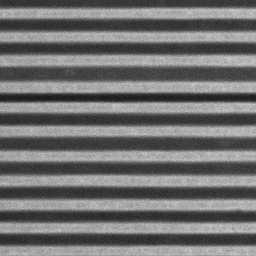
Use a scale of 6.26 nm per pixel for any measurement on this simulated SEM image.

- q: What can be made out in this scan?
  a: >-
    parallel lines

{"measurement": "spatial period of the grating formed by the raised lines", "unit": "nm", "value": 149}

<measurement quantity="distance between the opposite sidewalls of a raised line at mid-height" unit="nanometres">70.4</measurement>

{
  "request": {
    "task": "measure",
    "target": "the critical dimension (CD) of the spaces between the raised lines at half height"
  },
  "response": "0.0759 um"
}